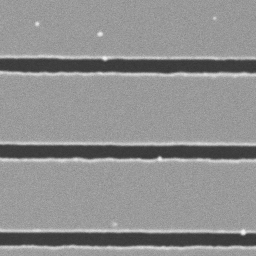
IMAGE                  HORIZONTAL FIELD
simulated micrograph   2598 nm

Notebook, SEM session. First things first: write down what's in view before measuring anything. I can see lines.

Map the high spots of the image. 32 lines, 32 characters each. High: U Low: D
UUUUUUUUUUUUUUUUUUUUUUUUUUUUUUUU
UUUUUUUUUUUUUUUUUUUUUUUUUUUUUUUU
UUUUUUUUUUUUUUUUUUUUUUUUUUUUUUUU
UUUUUUUUUUUUUUUUUUUUUUUUUUUUUUUU
UUUUUUUUUUUUUUUUUUUUUUUUUUUUUUUU
UUUUUUUUUUUUUUUUUUUUUUUUUUUUUUUU
UUUUUUUUUUUUUUUUUUUUUUUUUUUUUUUU
DDDDDDDDDDDDDDDDDDDDDDDDDDDDDDDD
DDDDDDDDDDDDDDDDDDDDDDDDDDDDDDDD
UUUUUUUUUUUUUUUUUUUUUUUUUUUUUUUU
UUUUUUUUUUUUUUUUUUUUUUUUUUUUUUUU
UUUUUUUUUUUUUUUUUUUUUUUUUUUUUUUU
UUUUUUUUUUUUUUUUUUUUUUUUUUUUUUUU
UUUUUUUUUUUUUUUUUUUUUUUUUUUUUUUU
UUUUUUUUUUUUUUUUUUUUUUUUUUUUUUUU
UUUUUUUUUUUUUUUUUUUUUUUUUUUUUUUU
UUUUUUUUUUUUUUUUUUUUUUUUUUUUUUUU
UUUUUUUUUUUUUUUUUUUUUUUUUUUUUUUU
DDDDDDDDDDDDDDDDDDDDDDDDDDDDDDDD
DDDDDDDDDDDDDDDDDDDDDDDDDDDDDDDD
UUUUUUUUUUUUUUUUUUUUUUUUUUUUUUUU
UUUUUUUUUUUUUUUUUUUUUUUUUUUUUUUU
UUUUUUUUUUUUUUUUUUUUUUUUUUUUUUUU
UUUUUUUUUUUUUUUUUUUUUUUUUUUUUUUU
UUUUUUUUUUUUUUUUUUUUUUUUUUUUUUUU
UUUUUUUUUUUUUUUUUUUUUUUUUUUUUUUU
UUUUUUUUUUUUUUUUUUUUUUUUUUUUUUUU
UUUUUUUUUUUUUUUUUUUUUUUUUUUUUUUU
UUUUUUUUUUUUUUUUUUUUUUUUUUUUUUUU
DDDDDDDDDDDDDDDDDDDDDDDDDDDDDDDD
DDDDDDDDDDDDDDDDDDDDDDDDDDDDDDDD
UUUUUUUUUUUUUUUUUUUUUUUUUUUUUUUU